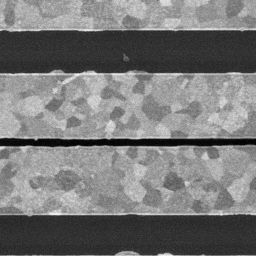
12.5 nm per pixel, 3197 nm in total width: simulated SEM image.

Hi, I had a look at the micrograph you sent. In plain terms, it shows lines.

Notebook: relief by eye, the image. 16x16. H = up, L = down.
HHHHHHHHHHHHHHHH
HHHHHHHHHHHHHHHH
LLLLLLLLLLLLLLLL
LLLLLLLLLLLLLLLL
LLLLLLLLLLLLLLLL
HHHHHHHHHHHHHHHH
HHHHHHHHHHHHHHHH
HHHHHHHHHHHHHHHH
HHHHHHHHHHHHHHHH
HHHHHHHHHHHHHHHH
HHHHHHHHHHHHHHHH
HHHHHHHHHHHHHHHH
HHHHHHHHHHHHHHHH
LLLLLLLLLLLLLLLL
LLLLLLLLLLLLLLLL
LLLLLLLLLLLLLLLL